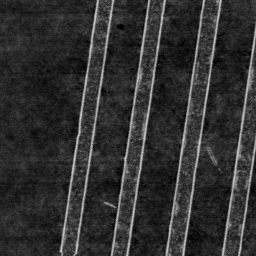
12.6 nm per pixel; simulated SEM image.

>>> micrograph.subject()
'parallel lines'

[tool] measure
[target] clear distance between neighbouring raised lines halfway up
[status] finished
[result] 480 nm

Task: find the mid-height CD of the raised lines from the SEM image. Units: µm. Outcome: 0.203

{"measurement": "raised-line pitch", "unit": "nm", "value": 669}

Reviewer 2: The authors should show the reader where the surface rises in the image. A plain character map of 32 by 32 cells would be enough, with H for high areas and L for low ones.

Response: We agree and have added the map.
LLLLLLLLLLLLHHLLLLLHHLLLLHHHLLLL
LLLLLLLLLLLLHHLLLLHHLLLLLHHLLLLL
LLLLLLLLLLLLHHLLLLHHLLLLLHHLLLLL
LLLLLLLLLLLLHHLLLLHHLLLLLHHLLLLL
LLLLLLLLLLLLHLLLLLHHLLLLLHHLLLLL
LLLLLLLLLLLHHLLLLLHHLLLLLHHLLLLL
LLLLLLLLLLLHHLLLLLHHLLLLLHHLLLLL
LLLLLLLLLLLHHLLLLLHHLLLLHHLLLLLH
LLLLLLLLLLLHHLLLLHHLLLLLHHLLLLLH
LLLLLLLLLLLHHLLLLHHLLLLLHHLLLLLH
LLLLLLLLLLLHHLLLLHHLLLLLHHLLLLLH
LLLLLLLLLLLHLLLLLHHLLLLLHHLLLLLH
LLLLLLLLLLHHLLLLLHHLLLLLHHLLLLLH
LLLLLLLLLLHHLLLLLHHLLLLLHHLLLLLH
LLLLLLLLLLHHLLLLHHHLLLLHHHLLLLHH
LLLLLLLLLLHHLLLLHHLLLLLHHLLLLLHH
LLLLLLLLLLHHLLLLHHLLLLLHHLLLLLHH
LLLLLLLLLLHHLLLLHHLLLLLHHLLLLLHH
LLLLLLLLLLHLLLLLHHLLLLLHHLLLLLHH
LLLLLLLLLHHLLLLLHHLLLLLHHLLLLLHH
LLLLLLLLLHHLLLLLHHLLLLHHHLLLLHHH
LLLLLLLLLHHLLLLHHLLLLLHHLLLLLHHL
LLLLLLLLLHHLLLLHHLLLLLHHLLLLLHHL
LLLLLLLLLHHLLLLHHLLLLLHHLLLLLHHL
LLLLLLLLLHHLLLLHHLLLLLHHLLLLLHHL
LLLLLLLLLHLLLLLHHLLLLLHHLLLLLHHL
LLLLLLLLHHLLLLLHHLLLLLHHLLLLLHHL
LLLLLLLLHHLLLLLHHLLLLHHHLLLLHHHL
LLLLLLLLHHLLLLHHLLLLLHHLLLLLHHLL
LLLLLLLLHHLLLLHHLLLLLHHLLLLLHHLL
LLLLLLLLHHLLLLHHLLLLLHHLLLLLHHLL
LLLLLLLLHHLLLLHHLLLLLHHLLLLLHHLL